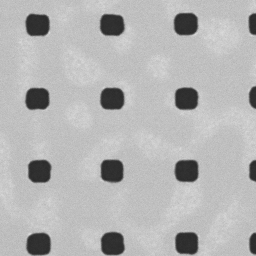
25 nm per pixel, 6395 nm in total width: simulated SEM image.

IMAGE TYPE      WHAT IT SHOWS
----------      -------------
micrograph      a regular array of holes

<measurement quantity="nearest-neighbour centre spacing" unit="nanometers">1810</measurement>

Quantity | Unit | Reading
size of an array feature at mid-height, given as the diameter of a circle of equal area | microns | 0.617